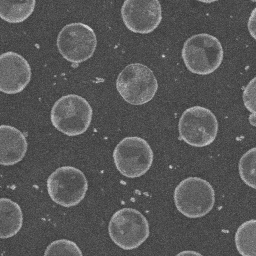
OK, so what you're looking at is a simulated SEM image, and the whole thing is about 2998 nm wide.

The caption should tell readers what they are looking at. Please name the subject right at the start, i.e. a regular array of raised bodies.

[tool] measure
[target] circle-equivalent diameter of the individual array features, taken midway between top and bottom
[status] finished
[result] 446 nm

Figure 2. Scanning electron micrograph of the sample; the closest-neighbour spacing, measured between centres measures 837 nm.